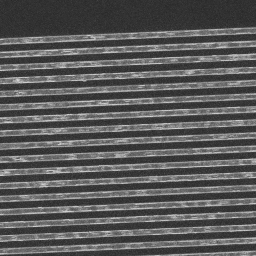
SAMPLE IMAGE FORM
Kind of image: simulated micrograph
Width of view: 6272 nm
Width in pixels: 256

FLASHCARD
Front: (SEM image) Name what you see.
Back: parallel lines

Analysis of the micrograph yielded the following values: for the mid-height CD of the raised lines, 0.132 microns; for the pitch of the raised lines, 321 nm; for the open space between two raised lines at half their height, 174 nm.